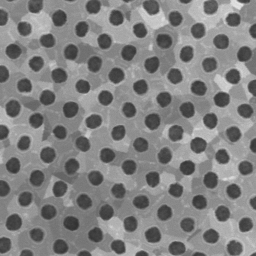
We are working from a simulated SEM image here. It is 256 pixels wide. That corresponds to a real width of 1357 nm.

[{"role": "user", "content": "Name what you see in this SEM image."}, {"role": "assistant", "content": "a regular array of holes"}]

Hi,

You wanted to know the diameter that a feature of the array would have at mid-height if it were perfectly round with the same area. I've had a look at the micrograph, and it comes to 87.7 nm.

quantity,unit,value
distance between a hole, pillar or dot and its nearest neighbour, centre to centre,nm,133